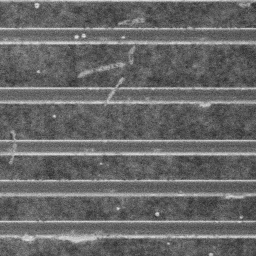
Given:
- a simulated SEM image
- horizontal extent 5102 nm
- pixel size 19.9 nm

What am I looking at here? lines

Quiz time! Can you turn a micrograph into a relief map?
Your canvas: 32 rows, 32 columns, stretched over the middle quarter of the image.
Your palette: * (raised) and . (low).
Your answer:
................................
................................
................................
................................
................................
................................
********************************
********************************
********************************
*******...*******.*.************
................................
................................
................................
................................
................................
................................
................................
................................
................................
********************************
********************************
********************************
..**.*...**.***.....*...........
................................
................................
................................
................................
................................
................................
********************************
********************************
********************************